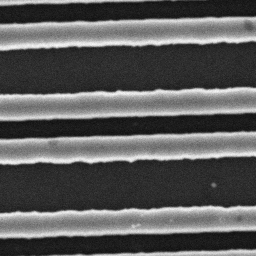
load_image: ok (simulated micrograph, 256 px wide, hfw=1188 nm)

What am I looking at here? lines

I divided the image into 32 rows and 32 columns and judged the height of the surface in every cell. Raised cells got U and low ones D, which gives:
UUUDDDDDDDDDDDDDDDDDDDDDDDDDDDDD
DDDDDDDDDDDDDDDDDDDDDDDDDDDDDDDD
DDDDDDDDDDDDDDDDDDUUUUUUUUUUUUUU
UUUUUUUUUUUUUUUUUUUUUUUUUUUUUUUU
UUUUUUUUUUUUUUUUUUUUUUUUUUUUUUUU
UUUUUUUUUUUUUUUUUUUUUDDDDUDDDDDD
DDDDDDDDDDDDDDDDDDDDDDDDDDDDDDDD
DDDDDDDDDDDDDDDDDDDDDDDDDDDDDDDD
DDDDDDDDDDDDDDDDDDDDDDDDDDDDDDDD
DDDDDDDDDDDDDDDDDDDDDDDDDDDDDDDD
DDDDDDDDDDDDDDDDDDDDDDDDDDDDDDDD
DDDDDDDDDDDDUDUUUUUUUUUUUUUUUUUU
UUUUUUUUUUUUUUUUUUUUUUUUUUUUUUUU
UUUUUUUUUUUUUUUUUUUUUUUUUUUUUUUU
UUUUUUUUUUUUUUUUDDDDDDDDDDDDDDDD
DDDDDDDDDDDDDDDDDDDDDDDDDDDDDDDD
DDDDDDDDDDDDDDDDDDDDDDDDDDDDDDDD
DUUUUUUUUUUUUUUUUUUUUUUUUUUUUUUU
UUUUUUUUUUUUUUUUUUUUUUUUUUUUUUUU
UUUUUUUUUUUUUUUUUUUUUUUUUUUUUUUU
UUUDDDDDDDDDDDDDDDDDDDDDDDDDDDDD
DDDDDDDDDDDDDDDDDDDDDDDDDDDDDDDD
DDDDDDDDDDDDDDDDDDDDDDDDDDDDDDDD
DDDDDDDDDDDDDDDDDDDDDDDDDDDDDDDD
DDDDDDDDDDDDDDDDDDDDDDDDDDDDDDDD
DDDDDDDDDDDDDDDDDDDDDDDDDDDDDDDD
DDUDUDDUUUUUUUUUUUUUUUUUUUUUUUUU
UUUUUUUUUUUUUUUUUUUUUUUUUUUUUUUU
UUUUUUUUUUUUUUUUUUUUUUUUUUUUUUUU
UUUUUUUDDDDDDDDDDDDDDDDDDDDDDDDD
DDDDDDDDDDDDDDDDDDDDDDDDDDDDDDDD
DDDDDDDDDDDDDDDDDDDDDDDUUUUUUUUU